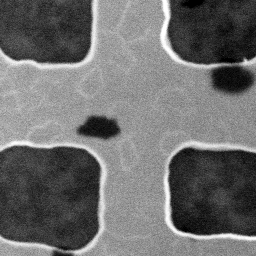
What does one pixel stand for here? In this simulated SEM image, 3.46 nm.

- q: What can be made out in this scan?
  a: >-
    holes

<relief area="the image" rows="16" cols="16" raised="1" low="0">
0000001111100000
0000001111100000
0000001111000000
0000011111100000
1111111111111111
1111111111111111
1111111111111111
1111111111111111
1111111111111111
0000001111100000
0000001111100000
0000001111100000
0000001111100000
0000001111100000
0000001111100000
1110011111111111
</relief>